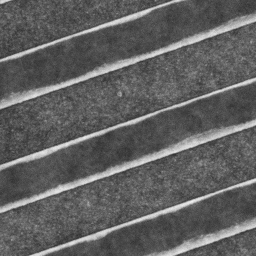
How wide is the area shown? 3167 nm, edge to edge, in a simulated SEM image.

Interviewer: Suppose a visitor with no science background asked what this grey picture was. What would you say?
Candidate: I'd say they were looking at lines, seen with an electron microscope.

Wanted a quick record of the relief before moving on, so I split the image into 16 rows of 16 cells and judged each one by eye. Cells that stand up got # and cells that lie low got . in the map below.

..........######
.......########.
....########....
.########.......
######..........
####..........##
#..........#####
........########
.....#########..
...########.....
########........
#####..........#
##..........####
.........#######
......#########.
...#########....